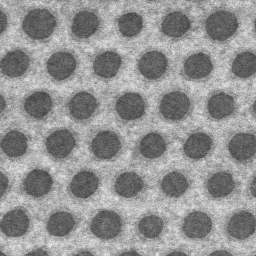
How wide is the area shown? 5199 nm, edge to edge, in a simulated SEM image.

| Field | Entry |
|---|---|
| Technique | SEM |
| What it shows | a regular array of raised bodies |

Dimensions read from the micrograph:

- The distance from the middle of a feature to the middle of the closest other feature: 0.916 µm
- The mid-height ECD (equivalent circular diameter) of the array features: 598 nanometres